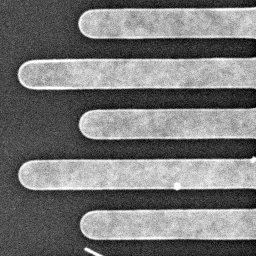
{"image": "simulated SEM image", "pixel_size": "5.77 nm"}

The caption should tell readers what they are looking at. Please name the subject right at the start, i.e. groups of lines, slits or small figures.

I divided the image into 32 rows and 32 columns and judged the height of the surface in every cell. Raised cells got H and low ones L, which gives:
LLLLLLLLLLLLLLLLLLLLLLLLLLLLLLLL
LLLLLLLLLLLHHHHHHHHHHHHHHHHHHHHH
LLLLLLLLLLHHHHHHHHHHHHHHHHHHHHHH
LLLLLLLLLLHHHHHHHHHHHHHHHHHHHHHH
LLLLLLLLLLLHHHHHHHHHHHHHHHHHHHHH
LLLLLLLLLLLLLLLLLLLLLLLLLLLLLLLL
LLLLLLLLLLLLLLLLLLLLLLLLLLLLLLLL
LLLLLLLLLHHHHHHHHHHHHHHHHHHHHHHH
LLLHHHHHHHHHHHHHHHHHHHHHHHHHHHHH
LLHHHHHHHHHHHHHHHHHHHHHHHHHHHHHH
LLLHHHHHHHHHHHHHHHHHHHHHHHHHHHHH
LLLLLLLLLLLLLLLLLLLLLLLLLLLLLLLL
LLLLLLLLLLLLLLLLLLLLLLLLLLLLLLLL
LLLLLLLLLLLLLLLLLLLLLLLLLLLLLLLL
LLLLLLLLLLHHHHHHHHHHHHHHHHHHHHHH
LLLLLLLLLLHHHHHHHHHHHHHHHHHHHHHH
LLLLLLLLLLHHHHHHHHHHHHHHHHHHHHHH
LLLLLLLLLLLLLLLLLLLLLLLLLLLLLLLL
LLLLLLLLLLLLLLLLLLLLLLLLLLLLLLLL
LLLLLLLLLLLLLLLLLLLLLLLLLLLLLLLL
LLLHHHHHHHHHHHHHHHHHHHHHHHHHHHHH
LLHHHHHHHHHHHHHHHHHHHHHHHHHHHHHH
LLLHHHHHHHHHHHHHHHHHHHHHHHHHHHHH
LLLLHHHHHHHHHHHHHLLLLHHLLLLLLLLL
LLLLLLLLLLLLLLLLLLLLLLLLLLLLLLLL
LLLLLLLLLLLLLLLLLLLLLLLLLLLLLLLL
LLLLLLLLLLLHHHHHHHHHHHHHHHHHHHHH
LLLLLLLLLLHHHHHHHHHHHHHHHHHHHHHH
LLLLLLLLLLHHHHHHHHHHHHHHHHHHHHHH
LLLLLLLLLLLHHHHHHHHHHHHHHHHHHHHH
LLLLLLLLLLLLLLLLLLLLLLLLLLLLLLLL
LLLLLLLLLLLLLLLLLLLLLLLLLLLLLLLL